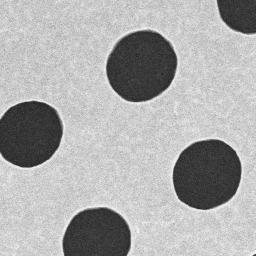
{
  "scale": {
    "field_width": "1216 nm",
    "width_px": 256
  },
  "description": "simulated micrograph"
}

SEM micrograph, holes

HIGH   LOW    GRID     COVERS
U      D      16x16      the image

UUUUUUUUUUUUUUDD
UUUUUUUUUUUUUUDD
UUUUUUUUDDUUUUUU
UUUUUUUDDDDUUUUU
UUUUUUUDDDDUUUUU
UUUUUUUDDDUUUUUU
UDDUUUUUUUUUUUUU
DDDDUUUUUUUUUUUU
DDDDUUUUUUUUUUUU
DDDUUUUUUUUDDDDU
UUUUUUUUUUUDDDDU
UUUUUUUUUUUDDDDU
UUUUUUUUUUUDDDUU
UUUUUDDDUUUUUUUU
UUUUDDDDUUUUUUUU
UUUUDDDDUUUUUUUU